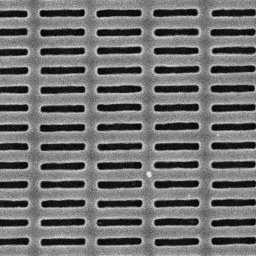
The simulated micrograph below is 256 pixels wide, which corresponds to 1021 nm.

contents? a regular array of holes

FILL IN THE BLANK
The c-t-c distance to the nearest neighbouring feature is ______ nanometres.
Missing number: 74.9